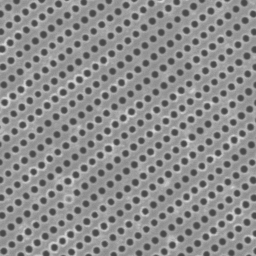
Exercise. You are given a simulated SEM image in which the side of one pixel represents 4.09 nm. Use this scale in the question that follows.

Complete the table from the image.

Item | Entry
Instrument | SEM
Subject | a regular array of holes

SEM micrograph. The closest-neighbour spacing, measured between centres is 0.042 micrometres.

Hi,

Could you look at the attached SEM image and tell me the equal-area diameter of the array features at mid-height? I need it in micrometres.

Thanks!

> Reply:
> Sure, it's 0.0292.